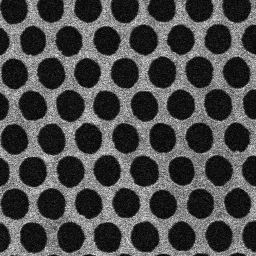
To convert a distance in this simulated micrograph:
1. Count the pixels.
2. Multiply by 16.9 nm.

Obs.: a regular array of holes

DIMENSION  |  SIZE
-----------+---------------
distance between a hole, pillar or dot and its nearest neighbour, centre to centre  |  36.8 pixels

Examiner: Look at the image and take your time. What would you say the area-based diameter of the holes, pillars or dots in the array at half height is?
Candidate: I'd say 495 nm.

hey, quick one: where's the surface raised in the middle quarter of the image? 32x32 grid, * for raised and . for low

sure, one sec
***......***......***.......**..
***......***.......**.......**..
**.......***.......**.......**..
***......***.......**.......***.
***......***......****.....****.
****....*****....******...******
*.********.*****************..**
....****.....*****....*****.....
.....***......***......***......
.....**.......**.......***......
.....**.......**........**......
.....**.......***.......**......
.....***.....****......***......
....*****....*****.....****....*
*.******************.***********
****....*****....*****.....*****
***......***......****......***.
***......***......***.......**..
***.......**.......**.......**..
***.......**.......**.......***.
***......***......****......***.
****.....****.....*****....*****
*****..********.****************
...******....*****....******...*
....****......***......***......
.....**.......***.......**......
.....**.......**........**......
.....**.......***.......**......
.....***......***.......***.....
....*****....*****.....****.....
...*******..*******..********.**
****...*******...******...******